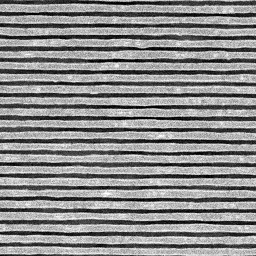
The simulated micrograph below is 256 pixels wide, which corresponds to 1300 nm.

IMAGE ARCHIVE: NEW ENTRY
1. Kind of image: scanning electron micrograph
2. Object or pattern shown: parallel lines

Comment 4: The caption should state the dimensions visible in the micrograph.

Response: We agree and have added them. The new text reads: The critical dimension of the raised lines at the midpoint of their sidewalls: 35.5 nm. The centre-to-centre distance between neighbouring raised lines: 58.7 nanometers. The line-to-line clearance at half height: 0.0203 micrometres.